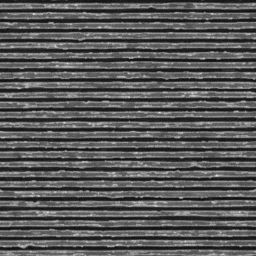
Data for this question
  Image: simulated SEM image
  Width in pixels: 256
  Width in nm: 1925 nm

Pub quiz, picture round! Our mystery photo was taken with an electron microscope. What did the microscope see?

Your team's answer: parallel lines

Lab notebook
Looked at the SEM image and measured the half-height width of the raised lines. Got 0.0414 microns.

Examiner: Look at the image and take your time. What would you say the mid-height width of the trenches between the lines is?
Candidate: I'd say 34.8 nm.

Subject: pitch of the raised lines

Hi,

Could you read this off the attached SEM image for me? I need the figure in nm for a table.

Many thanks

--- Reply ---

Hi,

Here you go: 74.4